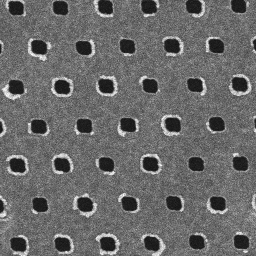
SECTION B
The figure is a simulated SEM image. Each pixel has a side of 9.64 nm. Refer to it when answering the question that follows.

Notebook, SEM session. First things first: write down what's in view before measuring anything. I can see a regular array of holes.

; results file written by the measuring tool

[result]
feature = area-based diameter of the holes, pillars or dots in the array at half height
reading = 149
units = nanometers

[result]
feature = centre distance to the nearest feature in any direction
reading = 0.427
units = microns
